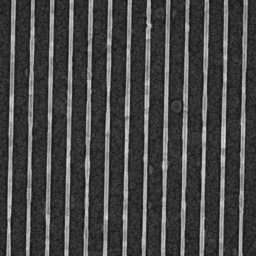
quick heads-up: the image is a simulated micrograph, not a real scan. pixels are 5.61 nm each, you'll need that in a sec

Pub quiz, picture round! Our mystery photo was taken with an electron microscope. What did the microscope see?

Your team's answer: parallel lines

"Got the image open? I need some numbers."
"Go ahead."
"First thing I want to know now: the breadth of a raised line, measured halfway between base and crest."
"14.7 nm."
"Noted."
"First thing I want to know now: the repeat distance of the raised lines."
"108 nanometers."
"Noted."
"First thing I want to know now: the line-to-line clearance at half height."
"91.2 nm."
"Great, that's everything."